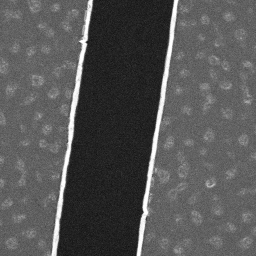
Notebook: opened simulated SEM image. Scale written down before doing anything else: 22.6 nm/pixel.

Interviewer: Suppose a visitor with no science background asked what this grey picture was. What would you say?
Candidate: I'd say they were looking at one or a few lines or trenches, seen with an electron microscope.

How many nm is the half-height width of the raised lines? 1930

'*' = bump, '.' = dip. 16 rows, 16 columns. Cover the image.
......*****.....
.....******.....
.....******.....
.....******.....
.....*****......
.....*****......
.....*****......
....******......
....******......
....******......
....*****.......
....*****.......
....*****.......
....*****.......
....*****.......
...******.......